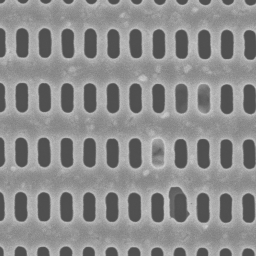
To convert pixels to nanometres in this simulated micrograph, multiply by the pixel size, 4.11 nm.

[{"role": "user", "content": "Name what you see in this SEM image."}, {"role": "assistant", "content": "a regular array of holes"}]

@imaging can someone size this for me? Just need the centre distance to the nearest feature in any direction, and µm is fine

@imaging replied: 0.0932